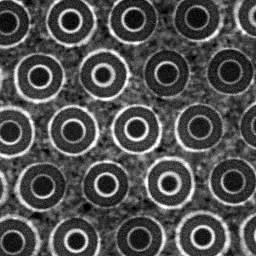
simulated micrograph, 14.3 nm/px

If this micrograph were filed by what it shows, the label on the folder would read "an array of small figures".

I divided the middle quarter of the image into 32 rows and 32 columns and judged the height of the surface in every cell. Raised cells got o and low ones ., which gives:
oooo.....oo.....oooo....oooo...o
oooo....oooo....oooo...oooooo..o
oooo...ooooo....oooo...oooooo..o
oooo...ooooo....oooo...ooooo...o
oooo....oooo....oooo....oooo...o
ooooo..........oooooo.........oo
oooooo........oooooooo........oo
ooooooo.......ooooooooo......ooo
oooooooo....oooooooooooooooooooo
oooooooooooooooooooooooooooooooo
ooooooooooooooooo..ooooooooooooo
.....oooooooooo.......oooooooo..
......oooooooo.........oooooo...
.......oooooo..........oooooo...
.ooo....oooo....oooo....oooo...o
ooooo...oooo....ooooo...oooo...o
ooooo...oooo....ooooo...oooo...o
ooooo...oooo....ooooo...oooo....
ooooo...ooooo....ooo....ooooo...
........ooooo..........oooooo...
.......ooooooo.........ooooooo..
......ooooooooo......oooooooooo.
o...oooooooooooooooooooooooooooo
oooooooooooooooooooooooooooooooo
ooooooooo...ooooooooooo.......oo
ooooooo.......oooooooo.........o
oooooo.........oooooo..........o
oooooo....o.....ooooo.....o.....
ooooo...ooooo...ooooo...oooo....
ooooo...ooooo...ooooo...ooooo...
.oooo...ooooo...ooooo...ooooo...
ooooo...ooooo...ooooo...oooo....